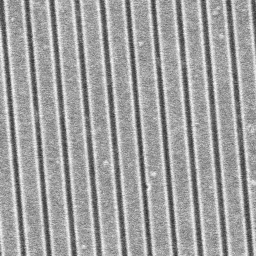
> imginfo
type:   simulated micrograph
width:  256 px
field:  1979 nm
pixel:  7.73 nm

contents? parallel lines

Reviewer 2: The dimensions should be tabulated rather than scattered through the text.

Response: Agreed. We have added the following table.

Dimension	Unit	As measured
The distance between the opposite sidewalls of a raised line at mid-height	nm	147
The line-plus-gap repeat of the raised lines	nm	194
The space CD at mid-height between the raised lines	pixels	6.6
